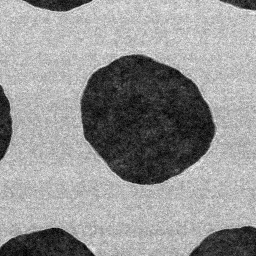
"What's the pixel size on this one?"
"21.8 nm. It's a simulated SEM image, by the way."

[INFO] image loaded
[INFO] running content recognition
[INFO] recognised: holes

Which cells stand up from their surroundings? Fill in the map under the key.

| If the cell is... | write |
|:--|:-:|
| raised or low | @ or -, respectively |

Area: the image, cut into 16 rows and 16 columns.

@@---@@@@@@@@@@-
@@@@@@@@@@@@@@@@
@@@@@@@@@@@@@@@@
@@@@@@@@-@@@@@@@
@@@@@@-----@@@@@
@@@@@-------@@@@
-@@@@--------@@@
-@@@@--------@@@
-@@@@--------@@@
@@@@@@-------@@@
@@@@@@@-----@@@@
@@@@@@@@@-@@@@@@
@@@@@@@@@@@@@@@@
@@@@@@@@@@@@@@@@
@@--@@@@@@@@@---
------@@@@@@----